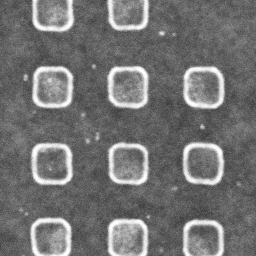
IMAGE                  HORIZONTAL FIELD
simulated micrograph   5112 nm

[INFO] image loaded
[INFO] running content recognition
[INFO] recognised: raised bodies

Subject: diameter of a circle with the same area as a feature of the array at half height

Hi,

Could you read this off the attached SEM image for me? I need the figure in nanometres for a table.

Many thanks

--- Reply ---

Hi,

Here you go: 794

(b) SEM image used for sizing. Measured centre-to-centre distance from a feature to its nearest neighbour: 1510 nanometers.